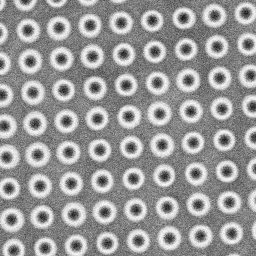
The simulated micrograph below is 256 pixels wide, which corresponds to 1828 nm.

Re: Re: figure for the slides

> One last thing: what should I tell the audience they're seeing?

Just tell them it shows an array of small figures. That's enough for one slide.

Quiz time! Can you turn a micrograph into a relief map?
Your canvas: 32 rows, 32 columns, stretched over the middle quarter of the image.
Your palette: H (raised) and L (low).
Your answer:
HHLLLHHHHLLLLLLLLLLLLLLLLLLLLLLL
LLLLLLLLLLLLLLLLLLLLLLLLLLLLLLHH
LLLLLLLLLLLLLLLLLLLLLLHHHLLLLHHH
LLLLLLHHHLLLLHHHHHLLLHHHHHLLHHHH
HHLLLHHHHHLLLHHHHHLLLHHHHHLLHHHH
HHLLLHHHHHHLLHHHHHLLLHHHHHLLHHHH
HHHLLHHHHHHLLHHHHHLLLHHHHHLLLHHH
HHLLLHHHHHLLLLHHHLLLLLHHLLLLLLLL
HHLLLLHHHLLLLLLLLLLLLLLLLLLLLLLL
LLLLLLLLLLLLLLLLLLLLLLLHHLLLLLHH
LLLLLLLLLLLLLLLHHLLLLLHHHHLLLHHH
LLLLLLHHHHLLLLHHHHHLLHHHHHHLLHHH
HHHLLLHHHHHLLHHHHHHLLHHHHHHLLHHH
HHHLLHHHHHHLLHHHHHHLLHHHHHHLLHHH
HHHLLLHHHHHLLLHHHHHLLLHHHHLLLLLH
HHHLLLHHHHLLLLLHHHLLLLLLLLLLLLLL
HHLLLLLLLLLLLLLLLLLLLLLLLLLLLLLL
LLLLLLLLLLLLLLLLLLLLLLLLHLLLLLLH
LLLLLLLLLLLLLLLHHHLLLLHHHHHLLLHH
HHLLLLLHHHHLLLHHHHHLLLHHHHHLLLHH
HHHLLLHHHHHHLLHHHHHHLLHHHHHLLLHH
HHHHLLHHHHHHLLHHHHHHLLHHHHHLLLHH
HHHHLLHHHHHHLLLHHHHLLLLHHHHLLLLL
HHHHLLLHHHHLLLLLHHLLLLLLLLLLLLLL
HHHLLLLLLLLLLLLLLLLLLLLLLLLLLLLL
LLLLLLLLLLLLLLLLLLLLLLLLHHLLLLLH
LLLLLLLLLHLLLLLLHHHLLLLHHHHLLLHH
HHHLLLLHHHHHLLLHHHHHLLHHHHHHLLHH
HHHHLLLHHHHHLLLHHHHHLLHHHHHHLLHH
HHHHHLLHHHHHLLLHHHHHLLLHHHHLLLLH
HHHHHLLHHHHHLLLHHHHLLLLLHHLLLLLL
HHHHLLLLHHHLLLLLLLLLLLLLLLLLLLLL